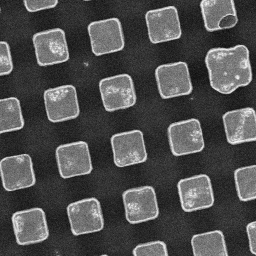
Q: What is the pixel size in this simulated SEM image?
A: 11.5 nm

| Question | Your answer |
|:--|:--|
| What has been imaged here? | a regular array of raised bodies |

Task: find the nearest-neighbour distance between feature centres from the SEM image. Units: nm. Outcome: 648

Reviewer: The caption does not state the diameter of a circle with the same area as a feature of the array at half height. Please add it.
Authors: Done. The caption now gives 413 nm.